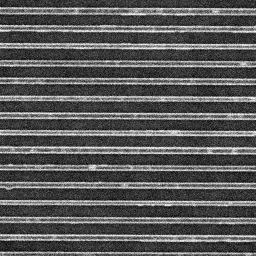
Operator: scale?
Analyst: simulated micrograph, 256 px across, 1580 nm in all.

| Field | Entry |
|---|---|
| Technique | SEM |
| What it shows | parallel lines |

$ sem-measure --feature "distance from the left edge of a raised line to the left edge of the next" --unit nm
108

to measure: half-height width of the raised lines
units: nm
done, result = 33.2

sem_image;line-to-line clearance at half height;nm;77.1